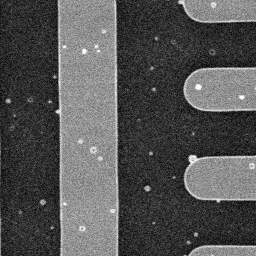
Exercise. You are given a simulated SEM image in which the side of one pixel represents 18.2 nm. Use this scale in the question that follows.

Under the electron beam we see groups of lines, slits or small figures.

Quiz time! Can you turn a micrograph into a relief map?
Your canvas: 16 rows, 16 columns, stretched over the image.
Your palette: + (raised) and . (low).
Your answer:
....+++.....++++
....+++.........
....+++.........
....+++.........
....+++.....++++
....+++.....++++
....+++.....++++
....+++.........
....+++.........
....+++.........
....+++.....++++
....+++.....++++
....+++.......++
....+++.........
....+++.........
....+++.....++++